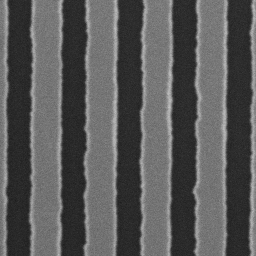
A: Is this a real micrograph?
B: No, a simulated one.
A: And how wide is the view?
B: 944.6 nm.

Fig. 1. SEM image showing lines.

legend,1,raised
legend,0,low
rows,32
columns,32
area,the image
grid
10001111000111100011110001110000
10001111000111100011100001110000
10001111000111100011100001110000
10001111000111100011100001110001
10001111000111100011110001110001
10001111000111100011110001110001
10001111000111100011110011110001
10001111000111100011110001110000
10001111000111100011100001110000
10001111000111100011100001110000
10001111000111100011100011110000
10001111000111100011100001110000
10001111000111100011100001110000
10001111000111100011100001110001
10001111000111100011100001110001
10001111000111100011100011110001
10001111000111100011100011110000
10001111000111100011100001110001
10001111000111100011100001110001
10001111000111100011100001110001
10001111000111100011100001110001
10001111000111100011100001110001
10001111000111000011100001110001
10001111000111100011100011110001
10001111000111100011100011110001
10001111000111000011100001110001
10001111000111100011100011110001
10001111000111100011100011110001
10001111000111100011100011110001
10001111000111100011100011110001
10001111000111100011100001110001
10001111000111000011100011110001